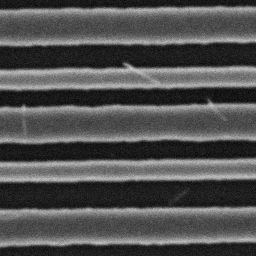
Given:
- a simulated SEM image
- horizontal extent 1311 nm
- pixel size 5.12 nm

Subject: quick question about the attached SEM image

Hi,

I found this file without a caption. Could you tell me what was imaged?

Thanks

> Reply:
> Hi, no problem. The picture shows lines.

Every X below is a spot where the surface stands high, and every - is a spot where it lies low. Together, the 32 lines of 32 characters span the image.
--------------------------------
XXXXXXXXXXXXXXXXXXXXXXXXXXXXXXXX
XXXXXXXXXXXXXXXXXXXXXXXXXXXXXXXX
XXXXXXXXXXXXXXXXXXXXXXXXXXXXXXXX
XXXXXXXXXXXXXXXXXXXXXXXXXXXXXXXX
XXXXXXXXXX------X-XXX-----------
--------------------------------
--------------------------------
---------------XX-----------XXXX
XXXXXXXXXXXXXXXXXXXXXXXXXXXXXXXX
XXXXXXXXXXXXXXXXXXXXXXXXXXXXXXXX
--------------------------------
--------------------------------
X-XX-XXXXXX-XXXXXXXXXXXXXXXXXXXX
XXXXXXXXXXXXXXXXXXXXXXXXXXXXXXXX
XXXXXXXXXXXXXXXXXXXXXXXXXXXXXXXX
XXXXXXXXXXXXXXXXXXXXXXXXXXXXXXXX
XXXXXXXXXXXXXXXXXXXX---XXXX----X
--------------------------------
--------------------------------
XXXXXXXXXXXXXXXXXXXXXXXXXXXXXXXX
XXXXXXXXXXXXXXXXXXXXXXXXXXXXXXXX
XXXXXXXXXX----X-----------------
--------------------------------
--------------------------------
--------------------------------
XXXXXXXXXXXXXXXXXXXXXXXXXXXXXXXX
XXXXXXXXXXXXXXXXXXXXXXXXXXXXXXXX
XXXXXXXXXXXXXXXXXXXXXXXXXXXXXXXX
XXXXXXXXXXXXXXXXXXXXXXXXXXXXXXXX
XXXXXXXXX--XXX---XXXX-----------
--------------------------------